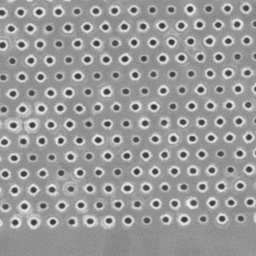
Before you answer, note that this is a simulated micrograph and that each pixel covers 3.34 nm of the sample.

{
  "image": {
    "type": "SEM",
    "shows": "a regular array of holes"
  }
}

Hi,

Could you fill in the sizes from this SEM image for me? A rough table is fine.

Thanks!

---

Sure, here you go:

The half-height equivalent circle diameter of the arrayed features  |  22.3 nm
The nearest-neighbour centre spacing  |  61.1 nm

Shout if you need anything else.